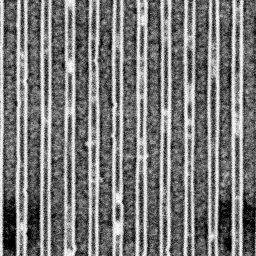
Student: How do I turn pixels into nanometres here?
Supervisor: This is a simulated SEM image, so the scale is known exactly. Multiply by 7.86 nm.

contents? parallel lines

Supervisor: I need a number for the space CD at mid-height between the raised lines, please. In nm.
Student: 128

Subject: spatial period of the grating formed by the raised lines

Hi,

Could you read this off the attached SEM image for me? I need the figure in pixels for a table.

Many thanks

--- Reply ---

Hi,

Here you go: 23.9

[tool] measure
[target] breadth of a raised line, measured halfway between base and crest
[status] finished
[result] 63.9 nm